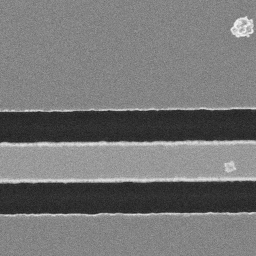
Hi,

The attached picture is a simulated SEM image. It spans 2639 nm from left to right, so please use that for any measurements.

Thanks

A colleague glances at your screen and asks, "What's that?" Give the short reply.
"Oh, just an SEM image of lines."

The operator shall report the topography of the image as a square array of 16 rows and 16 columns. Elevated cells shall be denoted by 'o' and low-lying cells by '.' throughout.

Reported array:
oooooooooooooooo
oooooooooooooooo
oooooooooooooooo
oooooooooooooooo
oooooooooooooooo
oooooooooooooooo
oooooooooooooooo
................
................
oooooooooooooooo
oooooooooooooooo
................
................
oooooooooooooooo
oooooooooooooooo
oooooooooooooooo